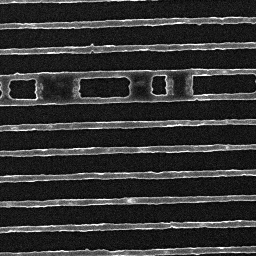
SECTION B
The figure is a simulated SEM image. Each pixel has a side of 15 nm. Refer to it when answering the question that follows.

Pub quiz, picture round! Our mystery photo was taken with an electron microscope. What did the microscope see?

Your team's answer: parallel lines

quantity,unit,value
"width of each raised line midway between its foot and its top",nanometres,88.2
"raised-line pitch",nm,382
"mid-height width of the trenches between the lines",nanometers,296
